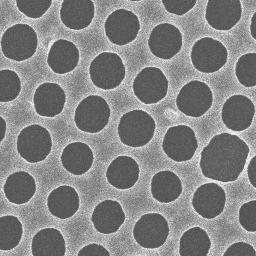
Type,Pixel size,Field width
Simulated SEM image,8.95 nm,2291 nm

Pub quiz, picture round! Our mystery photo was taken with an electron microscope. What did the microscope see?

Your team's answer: a regular array of holes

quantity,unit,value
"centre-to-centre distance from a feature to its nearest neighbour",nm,406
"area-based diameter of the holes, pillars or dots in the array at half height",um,0.311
